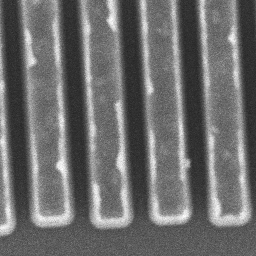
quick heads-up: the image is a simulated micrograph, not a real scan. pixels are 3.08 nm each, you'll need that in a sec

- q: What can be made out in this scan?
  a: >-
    parallel lines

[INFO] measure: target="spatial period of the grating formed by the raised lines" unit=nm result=182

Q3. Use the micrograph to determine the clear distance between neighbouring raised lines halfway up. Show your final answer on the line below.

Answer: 19.4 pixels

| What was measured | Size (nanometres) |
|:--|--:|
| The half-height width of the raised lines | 122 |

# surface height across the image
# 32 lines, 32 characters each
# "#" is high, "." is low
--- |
...####...#####..#####...#####..
...####...#####..#####...#####..
...####...#####..#####...#####..
...#####..#####..#####...#####..
...#####..#####...####...#####..
...#####..#####...#####..#####..
...#####..#####...#####..#####..
...#####..#####...#####..#####..
#..#####..#####...#####..#####..
#..#####...####...#####..#####..
#..#####...####...#####..#####..
#..#####...####...#####..#####..
#..#####...####...#####..#####..
#..#####...#####..#####...####..
#..#####...#####..#####...####..
#..#####...#####..#####...#####.
#..#####...#####..#####...####..
#...####...#####..#####...#####.
#...####...#####..#####...#####.
#...####...#####..#####...#####.
#...#####..#####..######..#####.
#...#####..#####...####...#####.
#...#####..#####...#####..#####.
#...#####..#####...#####..#####.
#...#####..#####...#####..#####.
##..#####..#####...#####..#####.
##..#####...####...#####..#####.
##..#####...####...####....####.
#...............................
................................
................................
................................